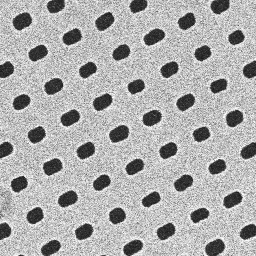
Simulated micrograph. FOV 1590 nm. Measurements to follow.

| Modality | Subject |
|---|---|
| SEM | a regular array of holes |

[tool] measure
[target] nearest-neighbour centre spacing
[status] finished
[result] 222 nm